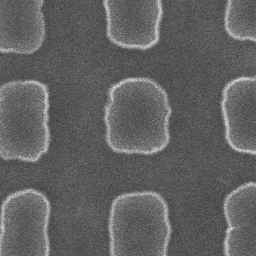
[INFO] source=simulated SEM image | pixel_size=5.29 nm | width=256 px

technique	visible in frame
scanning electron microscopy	raised bodies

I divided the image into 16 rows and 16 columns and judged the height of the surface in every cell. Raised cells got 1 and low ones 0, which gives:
1110000111000011
1110000111000011
1110000111000000
0000000000000000
0000000000000000
1110000111000011
1110000111100011
1110000111000011
1110000111100011
1110000011000001
0000000000000000
0000000000000000
1110000111000011
1110000111000011
1110000111100011
1110000111000011